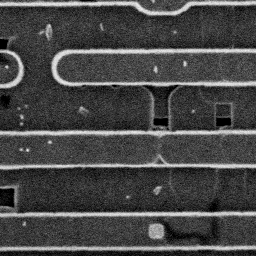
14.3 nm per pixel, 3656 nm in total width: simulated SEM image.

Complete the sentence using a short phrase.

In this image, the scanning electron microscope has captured wiring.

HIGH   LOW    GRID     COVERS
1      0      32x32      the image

00000000000000001111111100000000
00000000000000000011110000000000
00000000000000000000000000000000
00000000000000000000000000000000
00000000000000000000000000000000
00000000000000000000000000000000
10000000111111111111111111111111
11000001111111111111111111111111
11100001111111111111111111111111
11100001111111111111111111111111
11000000111000000000000000000000
00000000000000000000000000000000
00000000000000000000000000000000
00000000000000000000000000000000
00000000000000000000000000000000
00000000000000000000000000000000
00000000000000000000000000000000
11111111111111111111111111111111
11111111111111111111111111111111
11111111111111111111111111111111
11111111111111111111111111111111
00000000000000000000000000000000
00000000000000000000000000000000
00000000000000000000000000000000
00000000000000000000000000000000
00000000000000000000000000000000
00000000000000000000000000000000
11111111111111111111111111111111
11111111111111111110111111111111
11111111111111111110111111111111
11111111111111111111111111111111
00000000000000000000000000000000